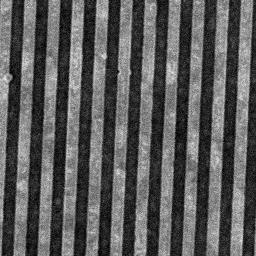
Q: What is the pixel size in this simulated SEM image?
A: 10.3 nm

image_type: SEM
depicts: parallel lines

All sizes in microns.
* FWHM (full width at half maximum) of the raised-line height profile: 0.109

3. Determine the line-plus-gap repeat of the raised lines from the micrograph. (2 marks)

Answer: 0.247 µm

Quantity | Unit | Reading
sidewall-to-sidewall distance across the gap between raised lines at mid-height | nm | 136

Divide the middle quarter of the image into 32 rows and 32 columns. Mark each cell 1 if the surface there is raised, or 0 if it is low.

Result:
00110000110000110000110000110000
00110000110000110000110000110000
00110000110000110000110000110000
00110000110000110000110000110000
00110000110000110000110000110000
00110001110000110000110000110000
00110001110000110000110001110000
01110001110000110000110001110000
01110001110000110001110001110001
01110001110001110001110001110001
01110001110001110001110001110001
01110001110001110001110001110001
01110001110001110001110001110001
01110001110001110001110001110001
01110001110001110001110001110001
01110001100001110001110001110001
01100001100001110001110001100001
01100001100001110001110001100001
01100001100001110001100001100001
01100001100001100001100001100001
01100001100001100001100001100001
01100001100001100001100001100001
01100001100001100001100001100001
01100001100001100001100001100001
01100001100001100001100001100001
01100001100001100001100001100001
01100001100001100001100001100001
01100001100001100001100001100001
01100011100001100001100001100011
01100011100001100001100001100011
11100011100001100001100011100011
11100011100011100011100011100011